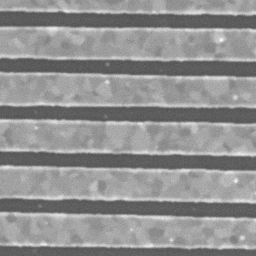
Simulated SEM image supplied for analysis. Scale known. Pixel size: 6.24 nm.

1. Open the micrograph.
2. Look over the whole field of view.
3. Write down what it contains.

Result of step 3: lines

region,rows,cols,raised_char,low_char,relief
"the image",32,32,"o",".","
oooooooooooooooooooooooooooooooo
........oooooooooooooooooooooooo
................................
ooooooo.........................
oooooooooooooooooooooooooooooooo
oooooooooooooooooooooooooooooooo
oooooooooooooooooooooooooooooooo
....................o.o.....oooo
................................
ooooooooooooooooooooo...........
oooooooooooooooooooooooooooooooo
oooooooooooooooooooooooooooooooo
oooooooooooooooooooooooooooooooo
................................
................................
oooooooooooooooooooooooooooooo..
oooooooooooooooooooooooooooooooo
oooooooooooooooooooooooooooooooo
oooooooooooooooooooooooooooooooo
................................
................................
oooooooooooooooooooooooooooooooo
oooooooooooooooooooooooooooooooo
oooooooooooooooooooooooooooooooo
oooooooooooooooooooooooooooooooo
................................
................................
oooooooooooooooooooooooooooooooo
oooooooooooooooooooooooooooooooo
oooooooooooooooooooooooooooooooo
oooooooooooooooooooooooooooooooo
................................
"